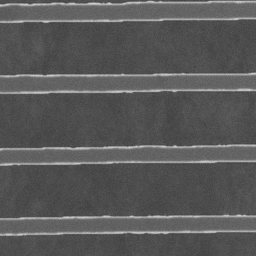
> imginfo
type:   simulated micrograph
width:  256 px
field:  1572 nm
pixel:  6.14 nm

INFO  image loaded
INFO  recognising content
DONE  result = lines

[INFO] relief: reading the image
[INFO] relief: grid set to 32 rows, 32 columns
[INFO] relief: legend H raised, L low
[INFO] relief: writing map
LLLLLLHHLLLHLHLHHHHHHHHHHHHHHHHH
HHHHHHHHHHHHHHHHHHHHHHHHHHHHHHHH
HHHHHHHHHHHHHHHHHHHHHLLLLLLLLLLL
LLLLLLLLLLLLLLLLLLLLLLLLLLLLLLLL
LLLLLLLLLLLLLLLLLLLLLLLLLLLLLLLL
LLLLLLLLLLLLLLLLLLLLLLLLLLLLLLLL
LLLLLLLLLLLLLLLLLLLLLLLLLLLLLLLL
LLLLLLLLLLLLLLLLLLLLLLLLLLLLLLLL
LLLLLLLLLLLLLLLLLLLLLLLLLLLLLLLL
LLHHHLHHHHHHHHHHHHHHHHHHHHHHHHHH
HHHHHHHHHHHHHHHHHHHHHHHHHHHHHHHH
HHHHHHHHHHHHHHHLLLLLLLLLLLLLLLLL
LLLLLLLLLLLLLLLLLLLLLLLLLLLLLLLL
LLLLLLLLLLLLLLLLLLLLLLLLLLLLLLLL
LLLLLLLLLLLLLLLLLLLLLLLLLLLLLLLL
LLLLLLLLLLLLLLLLLLLLLLLLLLLLLLLL
LLLLLLLLLLLLLLLLLLLLLLLLLLLLLLLL
LLLLLLLLLLLLLLLLLLLLLLLLLLLLLLLL
LLLLLHHHHHHHHHHHHHHHHHHHHHHHHHHH
HHHHHHHHHHHHHHHHHHHHHHHHHHHHHHHH
HHHHHHHHHHLLLLLLLLLLLLLLLLLLLLLL
LLLLLLLLLLLLLLLLLLLLLLLLLLLLLLLL
LLLLLLLLLLLLLLLLLLLLLLLLLLLLLLLL
LLLLLLLLLLLLLLLLLLLLLLLLLLLLLLLL
LLLLLLLLLLLLLLLLLLLLLLLLLLLLLLLL
LLLLLLLLLLLLLLLLLLLLLLLLLLLLLLLL
LLLLLLLLLLLLLLLLLLLLLLLLLLLLLLLL
HHHHHHHHHHHHHHHHHHHHHHHHHHHHHHHH
HHHHHHHHHHHHHHHHHHHHHHHHHHHHHHHH
LLLLLLLLLLLLLLLLLLLLLLLLLLLLLLLL
LLLLLLLLLLLLLLLLLLLLLLLLLLLLLLLL
LLLLLLLLLLLLLLLLLLLLLLLLLLLLLLLL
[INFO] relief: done